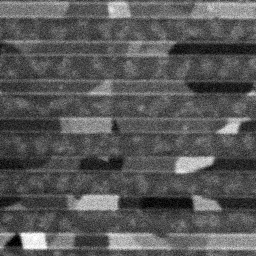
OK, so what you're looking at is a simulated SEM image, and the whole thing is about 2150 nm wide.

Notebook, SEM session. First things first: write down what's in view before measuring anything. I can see parallel lines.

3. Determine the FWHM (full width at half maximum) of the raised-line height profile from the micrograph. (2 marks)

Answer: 116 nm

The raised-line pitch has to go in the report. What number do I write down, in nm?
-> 324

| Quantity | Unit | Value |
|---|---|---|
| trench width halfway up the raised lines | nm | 206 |